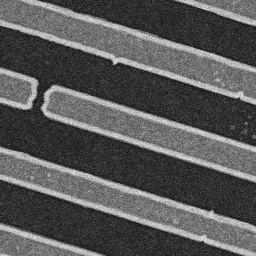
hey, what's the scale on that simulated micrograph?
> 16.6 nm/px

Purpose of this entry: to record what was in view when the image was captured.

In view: one or a few lines or trenches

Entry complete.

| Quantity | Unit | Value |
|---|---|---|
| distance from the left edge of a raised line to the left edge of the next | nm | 1240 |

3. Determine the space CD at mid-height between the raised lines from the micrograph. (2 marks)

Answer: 788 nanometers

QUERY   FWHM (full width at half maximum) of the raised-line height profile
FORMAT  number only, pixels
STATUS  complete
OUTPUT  28